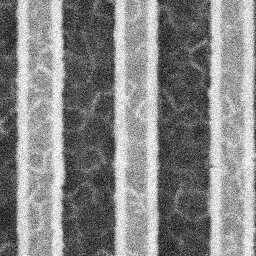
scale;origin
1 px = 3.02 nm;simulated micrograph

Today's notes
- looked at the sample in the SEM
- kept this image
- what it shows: one or a few lines or trenches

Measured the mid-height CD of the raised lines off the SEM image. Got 98.3 nanometres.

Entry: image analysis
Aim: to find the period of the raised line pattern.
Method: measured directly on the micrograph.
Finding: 290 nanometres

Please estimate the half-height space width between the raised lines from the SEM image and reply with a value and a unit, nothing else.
191 nm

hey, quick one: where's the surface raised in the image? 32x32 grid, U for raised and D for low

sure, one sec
DDDUUUUDDDDDDDDUUUUDDDDDDDDUUUUD
DDDUUUUDDDDDDDDUUUUDDDDDDDDUUUUD
DDDUUUUDDDDDDDDUUUUDDDDDDDDUUUUD
DDDUUUUDDDDDDDDUUUUDDDDDDDDUUUUD
DDDUUUUDDDDDDDDUUUUDDDDDDDDUUUUD
DDDUUUUDDDDDDDDUUUUDDDDDDDDUUUUD
DDDUUUUDDDDDDDDUUUUDDDDDDDDUUUUD
DDDUUUUDDDDDDDDUUUUDDDDDDDDUUUUD
DDDUUUUDDDDDDDDUUUUDDDDDDDDUUUUD
DDDUUUUDDDDDDDDUUUUDDDDDDDDUUUUD
DDDUUUUDDDDDDDDUUUUDDDDDDDDUUUUD
DDDUUUUDDDDDDDDUUUUDDDDDDDDUUUUD
DDDUUUUDDDDDDDDUUUUDDDDDDDDUUUUD
DDDUUUUDDDDDDDDUUUUDDDDDDDDUUUUD
DDDUUUUDDDDDDDDUUUUDDDDDDDDUUUUD
DDDUUUUDDDDDDDDUUUUDDDDDDDDUUUUD
DDDUUUUDDDDDDDDUUUUDDDDDDDDUUUUD
DDDUUUUDDDDDDDDUUUUDDDDDDDDUUUUD
DDDUUUUDDDDDDDDUUUUDDDDDDDDUUUUD
DDDUUUUDDDDDDDDUUUUDDDDDDDDUUUUD
DDDUUUUDDDDDDDDUUUUDDDDDDDDUUUUD
DDDUUUUDDDDDDDDUUUUDDDDDDDDUUUUD
DDDUUUUDDDDDDDDUUUUDDDDDDDDUUUUD
DDDUUUUDDDDDDDDUUUUDDDDDDDDUUUUD
DDDUUUUDDDDDDDDUUUUDDDDDDDDUUUUD
DDDUUUUDDDDDDDDUUUUDDDDDDDDUUUUD
DDDUUUUDDDDDDDDUUUUDDDDDDDDUUUUD
DDDUUUUDDDDDDDDUUUUDDDDDDDDUUUUD
DDDUUUUDDDDDDDDUUUUDDDDDDDDUUUUD
DDDUUUUDDDDDDDDUUUUDDDDDDDDUUUUD
DDDUUUUDDDDDDDDUUUUDDDDDDDDUUUUD
DDDUUUUDDDDDDDDUUUUDDDDDDDDUUUUD